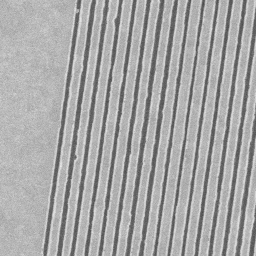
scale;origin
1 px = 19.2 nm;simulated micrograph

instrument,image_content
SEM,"parallel lines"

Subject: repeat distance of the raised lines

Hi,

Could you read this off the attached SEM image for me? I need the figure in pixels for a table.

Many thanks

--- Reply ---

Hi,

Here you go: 13.6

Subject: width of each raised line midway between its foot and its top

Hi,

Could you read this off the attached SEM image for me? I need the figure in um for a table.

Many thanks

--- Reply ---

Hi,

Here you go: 0.152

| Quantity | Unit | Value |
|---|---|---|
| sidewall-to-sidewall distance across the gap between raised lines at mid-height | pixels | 5.82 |